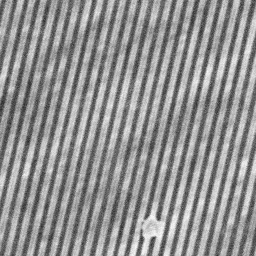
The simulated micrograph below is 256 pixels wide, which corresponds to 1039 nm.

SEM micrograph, parallel lines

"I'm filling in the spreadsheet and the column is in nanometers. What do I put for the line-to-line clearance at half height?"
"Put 28.7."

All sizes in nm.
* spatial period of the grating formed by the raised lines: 45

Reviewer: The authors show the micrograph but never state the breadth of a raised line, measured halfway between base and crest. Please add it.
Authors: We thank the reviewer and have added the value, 17.8 nanometres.